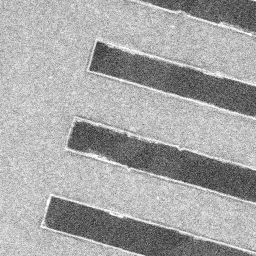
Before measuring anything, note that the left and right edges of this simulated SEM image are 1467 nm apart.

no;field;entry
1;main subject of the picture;one or a few lines or trenches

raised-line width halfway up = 187 nanometers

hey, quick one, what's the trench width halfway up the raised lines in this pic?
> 0.276 micrometres